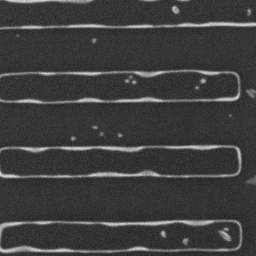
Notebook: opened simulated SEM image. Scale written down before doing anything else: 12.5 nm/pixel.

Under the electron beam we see groups of lines, slits or small figures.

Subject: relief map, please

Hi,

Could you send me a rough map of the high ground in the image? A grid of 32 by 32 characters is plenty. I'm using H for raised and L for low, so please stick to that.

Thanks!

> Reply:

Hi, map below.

HHHHHHHHHHHHHHHHHHHHHHHHHHHHHHHH
HHHHHHHHHHHHHHHHHHHHHHHHHHHHHHHH
HHHHHHHHHHHHHHHHHHHHHHHHHHHHHHHH
LLLLLLLLLLLLLLLLLLLLLLLLLLLLLLLL
LLLLLLLLLLLLLLLLLLLLLLLLLLLLLLLL
LLLLLLLLLLLLLLLLLLLLLLLLLLLLLLLL
LLLLLLLLLLLLLLLLLLLLLLLLLLLLLLLL
LLLLLLLLLLLLLLLLLLLLLLLLLLLLLLLL
LLLLLLLLLLLLLLLLLLLLLLLLLLLLLLLL
HHHHHHHHHHHHHHHHHHHHHHHHHHHHHHLL
HHHHHHHHHHHHHHHHHHHHHHHHHHHHHHLL
HHHHHHHHHHHHHHHHHHHHHHHHHHHHHHLL
HHHHHHHHHHHHHHHHHHLHHHHHHHHHLLLL
LLLLLLLLLLLLLLLLLLLLLLLLLLLLLLLL
LLLLLLLLLLLLLLLLLLLLLLLLLLLLLLLL
LLLLLLLLLLLLLLLLLLLLLLLLLLLLLLLL
LLLLLLLLLLLLLLLLLLLLLLLLLLLLLLLL
LLLLLLLLLLLLLLLLLLLLLLLLLLLLLLLL
LHHLLLHHLLLHHHLLLHHHHHHHHHHHHLLL
HHHHHHHHHHHHHHHHHHHHHHHHHHHHHHLL
HHHHHHHHHHHHHHHHHHHHHHHHHHHHHHLL
HHHHHHHHHHHHHHHHHHHHHHHHHHHHHHLL
LLLLLLLLLLLLLLLLLLLLLLLLLLLLLLLL
LLLLLLLLLLLLLLLLLLLLLLLLLLLLLLLL
LLLLLLLLLLLLLLLLLLLLLLLLLLLLLLLL
LLLLLLLLLLLLLLLLLLLLLLLLLLLLLLLL
LLLLLLLLLLLLLLLLLLLLLLLLLLLLLLLL
LLLLLLLLLLLLLLLLLLLLLLLLLLLLLLLL
HHHHHHHHHHHHHHHHHHHHHHHHHHHHHHLL
HHHHHHHHHHHHHHHHHHHHHHHHHHHHHHLL
HHHHHHHHHHHHHHHHHHHHHHHHHHHHHHLL
LLLLLLLLLLLLLLLLLLLLLLLLLLLLLLLL